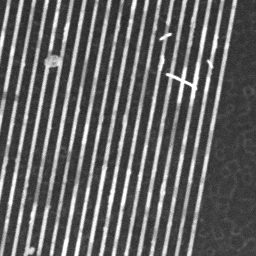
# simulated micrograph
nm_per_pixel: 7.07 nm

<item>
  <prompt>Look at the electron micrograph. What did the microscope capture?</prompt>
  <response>parallel lines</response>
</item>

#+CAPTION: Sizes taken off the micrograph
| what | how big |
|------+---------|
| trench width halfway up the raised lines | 9.36 pixels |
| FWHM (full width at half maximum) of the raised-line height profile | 19.2 nm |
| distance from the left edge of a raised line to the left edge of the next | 87.4 nanometers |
